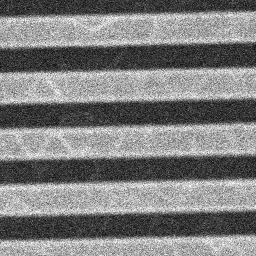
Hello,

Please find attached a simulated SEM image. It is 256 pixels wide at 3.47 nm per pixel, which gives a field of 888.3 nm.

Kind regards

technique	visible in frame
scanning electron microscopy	parallel lines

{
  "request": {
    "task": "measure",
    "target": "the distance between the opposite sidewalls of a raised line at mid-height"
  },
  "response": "0.105 micrometres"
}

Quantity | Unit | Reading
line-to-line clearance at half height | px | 26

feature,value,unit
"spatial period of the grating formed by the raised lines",194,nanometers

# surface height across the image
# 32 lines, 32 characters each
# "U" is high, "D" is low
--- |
DDDDDDDDDDDDDDDDDDDDDDDDDDDDDDDD
DDDDDDDDDDDDDDDDDDDDDDDDDDDDDDDD
UUUUUUUUUUUUUUUUUUUUUUUUUUUUUUUU
UUUUUUUUUUUUUUUUUUUUUUUUUUUUUUUU
UUUUUUUUUUUUUUUUUUUUUUUUUUUUUUUU
UUUUUUUUUUUUUUUUUUUDDDDDDDDDDDDD
DDDDDDDDDDDDDDDDDDDDDDDDDDDDDDDD
DDDDDDDDDDDDDDDDDDDDDDDDDDDDDDDD
DDDDDDDDDDDDDDDDDDDDDDDDDDDDDDDD
UUUUUUUUUUUUUUUUUUUUUUUUUUUUUUUU
UUUUUUUUUUUUUUUUUUUUUUUUUUUUUUUU
UUUUUUUUUUUUUUUUUUUUUUUUUUUUUUUU
UUUUUUUUUUUUUUUUUDUUUDDDDDDDDDDD
DDDDDDDDDDDDDDDDDDDDDDDDDDDDDDDD
DDDDDDDDDDDDDDDDDDDDDDDDDDDDDDDD
DDDDDDDDDDDDDDDDDDDDDDDDDDDDDDDD
UUUUUUUUUUUUUUUUUUUUUUUUUUUUUUUU
UUUUUUUUUUUUUUUUUUUUUUUUUUUUUUUU
UUUUUUUUUUUUUUUUUUUUUUUUUUUUUUUU
UUUUUUUUUUUUUUUUUDDDDDDDDDDDDDDD
DDDDDDDDDDDDDDDDDDDDDDDDDDDDDDDD
DDDDDDDDDDDDDDDDDDDDDDDDDDDDDDDD
DDDDDDDDDDDDDDDDDDDDDDDDDDDDDDDD
UUUUUUUUUUUUUUUUUUUUUUUUUUUUUUUU
UUUUUUUUUUUUUUUUUUUUUUUUUUUUUUUU
UUUUUUUUUUUUUUUUUUUUUUUUUUUUUUUU
UUUUUUUUUUUUUUUUUUUDDDDDDDDDDDDD
DDDDDDDDDDDDDDDDDDDDDDDDDDDDDDDD
DDDDDDDDDDDDDDDDDDDDDDDDDDDDDDDD
DDDDDDDDDDDDDDDDDDDDDDDDDDDDDDDU
UUUUUUUUUUUUUUUUUUUUUUUUUUUUUUUU
UUUUUUUUUUUUUUUUUUUUUUUUUUUUUUUU